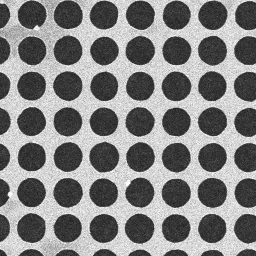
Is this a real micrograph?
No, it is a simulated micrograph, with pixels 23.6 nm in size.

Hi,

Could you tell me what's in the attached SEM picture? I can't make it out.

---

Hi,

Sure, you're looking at a regular array of holes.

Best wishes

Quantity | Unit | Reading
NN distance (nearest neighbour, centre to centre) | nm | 835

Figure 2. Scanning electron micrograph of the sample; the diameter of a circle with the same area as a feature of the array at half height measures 29.4 px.